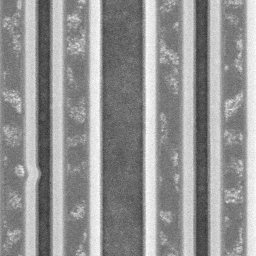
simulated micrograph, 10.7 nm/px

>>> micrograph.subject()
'one or a few lines or trenches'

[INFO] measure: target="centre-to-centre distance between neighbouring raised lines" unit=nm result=845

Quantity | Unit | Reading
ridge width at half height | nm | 408